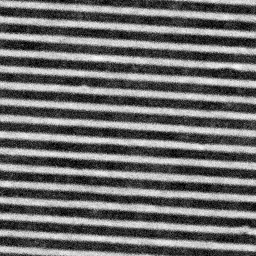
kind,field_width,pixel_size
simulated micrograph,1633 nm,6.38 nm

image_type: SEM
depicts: parallel lines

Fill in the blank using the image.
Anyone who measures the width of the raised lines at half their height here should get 38.2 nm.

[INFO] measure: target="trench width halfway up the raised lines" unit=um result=0.0708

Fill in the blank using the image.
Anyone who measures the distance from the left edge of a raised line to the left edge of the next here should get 0.104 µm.